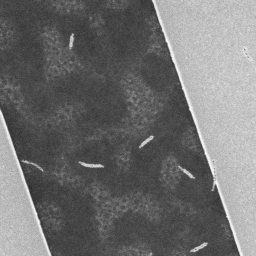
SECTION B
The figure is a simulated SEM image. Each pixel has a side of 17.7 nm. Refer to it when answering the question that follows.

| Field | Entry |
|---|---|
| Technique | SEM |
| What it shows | one or a few lines or trenches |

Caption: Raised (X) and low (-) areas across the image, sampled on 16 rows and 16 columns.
----------XXXXXX
----------XXXXXX
----------XXXXXX
-----------XXXXX
-----------XXXXX
-----------XXXXX
------------XXXX
------------XXXX
X-----------XXXX
X------------XXX
X------------XXX
XX------------XX
XX------------XX
XX------------XX
XXX------------X
XXX------------X